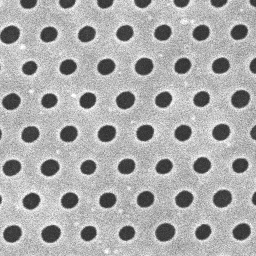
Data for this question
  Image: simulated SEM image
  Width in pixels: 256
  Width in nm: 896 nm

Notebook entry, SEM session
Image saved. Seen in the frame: a regular array of holes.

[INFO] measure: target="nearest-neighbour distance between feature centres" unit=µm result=0.132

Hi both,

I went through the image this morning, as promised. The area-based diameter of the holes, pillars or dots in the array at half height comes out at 0.0606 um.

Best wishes